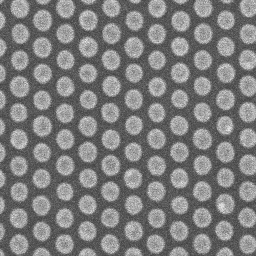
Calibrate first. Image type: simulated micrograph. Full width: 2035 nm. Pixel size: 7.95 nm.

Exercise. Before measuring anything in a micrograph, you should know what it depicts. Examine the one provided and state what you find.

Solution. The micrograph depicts a regular array of raised bodies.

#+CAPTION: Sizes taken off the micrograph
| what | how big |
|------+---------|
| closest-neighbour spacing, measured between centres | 206 nanometres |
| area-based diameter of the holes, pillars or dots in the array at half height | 142 nm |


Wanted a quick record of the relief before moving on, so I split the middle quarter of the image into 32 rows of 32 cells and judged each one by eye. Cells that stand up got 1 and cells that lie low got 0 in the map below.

11000110001111001110001110001100
00001111000000001110000000011110
00001111000000001110000000011110
10001111000110001110000100011110
11000010001110000100001110001100
11000000001111000000011110000000
11000000001111000100011110000000
11000110000110001110001100011100
00001111000000011110000000011110
00001111000000011110000000011110
10000111001110001110001100001100
11000000001111000000011110000000
11000000001111000000011110000000
11000110001110001110001110001100
10001111000000001110000100011110
00001111000000001110000000011110
00001111000000001110001100011110
11000110001110000100011110001100
11000000001111000000011110000000
11000000001111000000011110000000
11001110001110001110001110011100
00001111000000011110000000011110
00001111000000011110000000011110
10001111001110001110001100011100
11000000001111000000011110000000
11000000001111000000011110000000
11000110001111001100011110001100
10001111000110011110000100011100
00001111000000011110000000011110
00001111000000011110001000011110
10000110001110001110011110001100
11000000011111000000011110000000